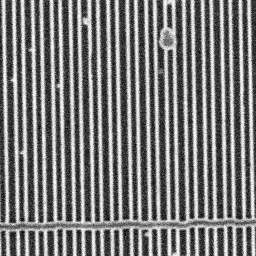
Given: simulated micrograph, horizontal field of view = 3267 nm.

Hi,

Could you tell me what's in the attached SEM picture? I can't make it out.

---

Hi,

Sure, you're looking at parallel lines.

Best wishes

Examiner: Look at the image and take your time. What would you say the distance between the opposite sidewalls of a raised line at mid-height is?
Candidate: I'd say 28.7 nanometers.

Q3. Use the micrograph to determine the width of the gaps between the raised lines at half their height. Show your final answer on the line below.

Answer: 86.1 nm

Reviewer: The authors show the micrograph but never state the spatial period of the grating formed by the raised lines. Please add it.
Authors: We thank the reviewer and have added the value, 9.44 pixels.